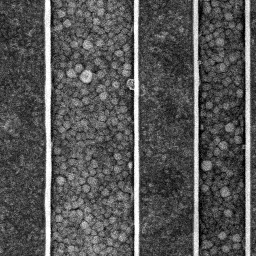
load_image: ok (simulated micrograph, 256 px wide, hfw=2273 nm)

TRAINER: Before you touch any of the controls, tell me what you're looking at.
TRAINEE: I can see one or a few lines or trenches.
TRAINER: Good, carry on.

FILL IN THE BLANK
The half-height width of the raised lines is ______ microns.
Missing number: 0.527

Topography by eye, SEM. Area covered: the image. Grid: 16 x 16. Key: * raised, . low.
***......***...*
***......***...*
***......***...*
***......***...*
***......***...*
***......***...*
***......***...*
***......***...*
***......***...*
***......***...*
***......***....
***......***...*
***......***...*
***......***....
***......***....
***......***....